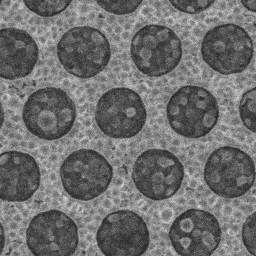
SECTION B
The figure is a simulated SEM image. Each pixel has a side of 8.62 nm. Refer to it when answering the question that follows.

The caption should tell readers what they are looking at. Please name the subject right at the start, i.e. a regular array of holes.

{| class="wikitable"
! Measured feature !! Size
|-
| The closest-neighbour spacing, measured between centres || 0.603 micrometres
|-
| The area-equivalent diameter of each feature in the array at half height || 48.1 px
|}